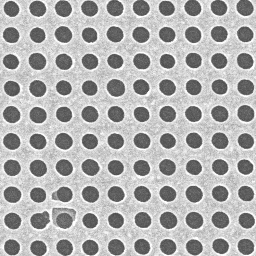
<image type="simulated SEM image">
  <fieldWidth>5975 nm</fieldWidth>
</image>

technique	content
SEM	a regular array of holes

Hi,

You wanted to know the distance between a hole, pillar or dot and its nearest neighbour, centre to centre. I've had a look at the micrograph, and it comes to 602 nm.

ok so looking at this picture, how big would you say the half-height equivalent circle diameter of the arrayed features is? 391 nm